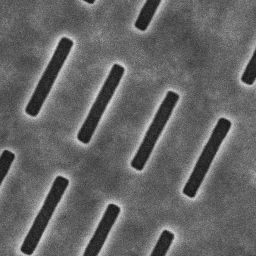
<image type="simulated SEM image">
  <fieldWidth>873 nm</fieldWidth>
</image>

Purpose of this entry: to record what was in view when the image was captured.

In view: holes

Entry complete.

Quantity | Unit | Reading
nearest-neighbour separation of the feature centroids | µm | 0.2